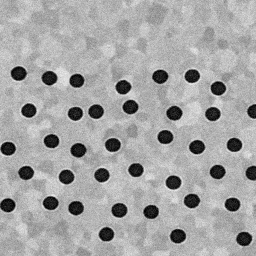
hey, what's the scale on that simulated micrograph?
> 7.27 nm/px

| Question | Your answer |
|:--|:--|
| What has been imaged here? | a regular array of holes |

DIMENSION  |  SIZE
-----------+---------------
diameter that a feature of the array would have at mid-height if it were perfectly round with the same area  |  113 nanometers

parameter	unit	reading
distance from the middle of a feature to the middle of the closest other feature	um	0.206